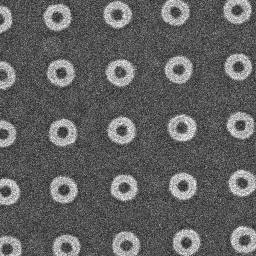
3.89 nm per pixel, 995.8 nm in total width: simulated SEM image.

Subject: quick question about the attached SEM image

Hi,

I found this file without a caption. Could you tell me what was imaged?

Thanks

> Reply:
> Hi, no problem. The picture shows a regular array of ring-shaped raised bodies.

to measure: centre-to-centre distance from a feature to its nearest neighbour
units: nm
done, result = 225